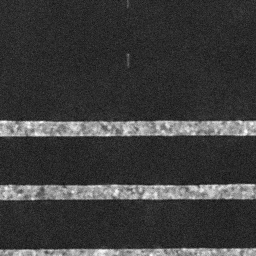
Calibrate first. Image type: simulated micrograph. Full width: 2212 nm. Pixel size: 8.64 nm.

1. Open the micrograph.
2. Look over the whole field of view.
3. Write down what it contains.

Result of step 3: one or a few lines or trenches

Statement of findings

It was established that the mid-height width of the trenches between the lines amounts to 435 nm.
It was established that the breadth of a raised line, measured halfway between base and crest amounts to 120 nanometres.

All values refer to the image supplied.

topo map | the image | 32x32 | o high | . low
................................
................................
................................
................................
................................
................................
................................
................................
................................
................................
................................
................................
................................
................................
................................
oooooooooooooooooooooooooooooooo
oooooooooooooooooooooooooooooooo
................................
................................
................................
................................
................................
................................
oooooooooooooooooooooooooooooooo
oooooooooooooooooooooooooooooooo
................................
................................
................................
................................
................................
................................
oooooooooooooooooooooooooooooooo